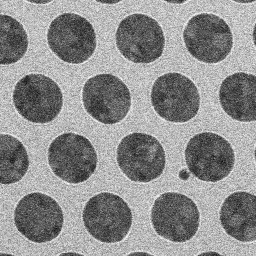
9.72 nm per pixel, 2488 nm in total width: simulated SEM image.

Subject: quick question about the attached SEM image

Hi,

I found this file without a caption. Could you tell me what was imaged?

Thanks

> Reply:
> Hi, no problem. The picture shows a regular array of raised bodies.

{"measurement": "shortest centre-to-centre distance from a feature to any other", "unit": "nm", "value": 661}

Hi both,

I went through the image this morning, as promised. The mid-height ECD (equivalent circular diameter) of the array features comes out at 504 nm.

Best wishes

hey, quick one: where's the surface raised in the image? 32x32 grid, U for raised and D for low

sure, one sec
DDDDUUDDDDDDDUUDDDDDDUUDDDDDDDDD
DDDDDDDDDDDDDDDDDDDDDDDDDDDDDDDD
UUDDDDDUUUUDDDDUUUUUDDDDUUUUDDDD
UUUDDDUUUUUUDDDUUUUUDDDUUUUUUDDD
UUUUDDUUUUUUDDUUUUUUUDDUUUUUUDDU
UUUUDDUUUUUUDDUUUUUUUDDUUUUUUDDD
UUUDDDUUUUUUDDDUUUUUDDDUUUUUUDDD
UUUDDDDDUUUDDDDDUUUUDDDDDUUUDDDD
DDDDDDDDDDDDDDDDDDDDDDDDDDDDDDDD
DDDUUUDDDDDDUUUDDDDDUUUDDDDDUUUU
DDUUUUUDDDUUUUUUDDDUUUUUDDDDUUUU
DDUUUUUUDDUUUUUUDDDUUUUUUDDUUUUU
DDUUUUUUDDUUUUUUDDDUUUUUUDDUUUUU
DDUUUUUUDDUUUUUUDDDUUUUUUDDDUUUU
DDUUUUUDDDDUUUUUDDDDUUUUDDDDUUUU
DDDDDUDDDDDDDUUDDDDDDDDDDDDDDDDD
DDDDDDDDDDDDDDDDDDDDDDDDDUUDDDDD
UUDDDDDUUUUDDDDUUUUUDDDDUUUUDDDD
UUUDDDUUUUUUDDDUUUUUUDDUUUUUUDDD
UUUUDDUUUUUUDDUUUUUUUDDUUUUUUDDD
UUUUDDUUUUUUDDDUUUUUUDDUUUUUUDDD
UUUDDDDUUUUUDDDUUUUUDDUUUUUUUDDD
UUUDDDDDUUUDDDDDUUUDDDDDDUUUDDDD
DDDDDDDDDDDDDDDDDDDDDDDDDDDDDDDD
DDDUUUDDDDDDUUUDDDDDUUUDDDDDUUUU
DDUUUUUDDDDUUUUUDDDUUUUUUDDDUUUU
DDUUUUUUDDUUUUUUUDDUUUUUUDDUUUUU
DDUUUUUUDDUUUUUUUDDUUUUUUDDUUUUU
DDUUUUUUDDDUUUUUDDDUUUUUUDDDUUUU
DDDUUUUDDDDUUUUUDDDDUUUUDDDDDUUU
DDDDDDDDDDDDDDDDDDDDDDDDDDDDDDDD
DDDDDDDDUUDDDDDDUUDDDDDDDUUDDDDD